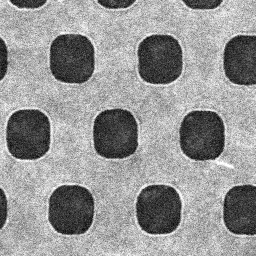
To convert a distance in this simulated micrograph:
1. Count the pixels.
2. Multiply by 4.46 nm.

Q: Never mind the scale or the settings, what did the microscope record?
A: holes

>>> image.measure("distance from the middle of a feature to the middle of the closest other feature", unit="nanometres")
387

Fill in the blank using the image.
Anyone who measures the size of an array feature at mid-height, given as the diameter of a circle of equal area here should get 0.228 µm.